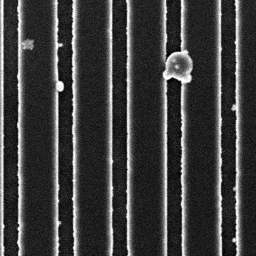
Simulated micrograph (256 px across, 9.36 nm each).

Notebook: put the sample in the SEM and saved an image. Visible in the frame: lines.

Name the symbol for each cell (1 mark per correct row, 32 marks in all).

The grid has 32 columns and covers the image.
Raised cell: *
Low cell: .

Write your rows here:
..*****..*****..*****..*****.***
..*****..*****..*****..*****..**
..*****..*****..*****..*****..**
..*****..*****..*****..*****..**
..*****..*****..*****..*****..**
..*****..*****..*****..*****.***
..*****..*****..*****.******..**
..*****..*****..************..**
..*****..*****..************..**
..*****..*****..************.***
..******.*****..*****..*****..**
..*****..*****..*****..*****..**
..*****..*****..*****..*****..**
..*****..*****..*****..*****..**
..*****..*****..*****..*****..**
..*****..*****..*****..*****..**
..*****..*****..*****..*****..**
..*****..*****..*****..*****..**
..*****..*****..*****..*****..**
..*****..*****..*****..*****..**
..*****..*****..*****..*****..**
..*****..*****..*****..*****..**
..*****..*****..*****..*****..**
..*****..*****..*****..*****..**
..*****..*****..*****..*****.***
..*****..*****..*****..*****..**
..*****..*****..*****..*****..**
..*****..*****..*****..*****..**
..*****..*****..*****..*****..**
..*****..*****..*****..*****..**
..*****..*****..*****..*****..**
..*****..*****..*****..*****..**